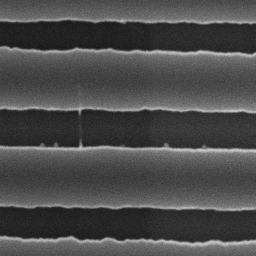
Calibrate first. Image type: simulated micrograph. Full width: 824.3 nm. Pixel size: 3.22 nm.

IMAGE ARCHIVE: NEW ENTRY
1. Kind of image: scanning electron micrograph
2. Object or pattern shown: lines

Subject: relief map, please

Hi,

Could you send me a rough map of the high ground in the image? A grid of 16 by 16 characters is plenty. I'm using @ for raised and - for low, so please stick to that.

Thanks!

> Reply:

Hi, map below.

@@@@@@@@@@@@@@@@
----------------
----------------
@@@@@@@@@@@@@@@@
@@@@@@@@@@@@@@@@
@@@@@@@@@@@@@@@@
@@@@@@@@@@@@@@@@
----------------
----------------
@@@@@@@@@@@@@@@@
@@@@@@@@@@@@@@@@
@@@@@@@@@@@@@@@@
@@@@@@@@@@@@@@@@
----------------
----------------
@@@@@@@@@@@@@@@@